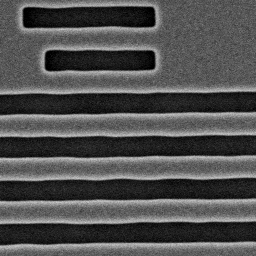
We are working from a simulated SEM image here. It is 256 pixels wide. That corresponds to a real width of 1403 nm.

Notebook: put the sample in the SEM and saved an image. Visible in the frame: groups of lines, slits or small figures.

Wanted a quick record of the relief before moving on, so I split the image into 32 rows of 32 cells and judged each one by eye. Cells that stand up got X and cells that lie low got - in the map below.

XXXXXXXXXXXXXXXXXXXXXXXXXXXXXXXX
XXX----------------XXXXXXXXXXXXX
XXX-----------------XXXXXXXXXXXX
XXX----------XXX---XXXXXXXXXXXXX
XXXXXXXXXXXXXXXXXXXXXXXXXXXXXXXX
XXXXXXXXXXXXXXXXXXXXXXXXXXXXXXXX
XXXXXX-------------XXXXXXXXXXXXX
XXXXX---------------XXXXXXXXXXXX
XXXXXX-------------XXXXXXXXXXXXX
XXXXXXXXXXXXXXXXXXXXXXXXXXXXXXXX
XXXXXXXXXXXXXXXXXXXXXXXXXXXXXXXX
XXXXXXXXXXXXXXXXXXX-------------
--------------------------------
--------------------------------
XXXXXXXXXXXXXXXXXXXXXXXXXXXXXXXX
XXXXXXXXXXXXXXXXXXXXXXXXXXXXXXXX
XXXXXXXXXXXXXXXXXXXXXXXXXXXXXXXX
--------------------------------
--------------------------------
--------------------------------
XXXXXXXXXXXXXXXXXXXXXXXXXXXXXXXX
XXXXXXXXXXXXXXXXXXXXXXXXXXXXXXXX
--------------------------------
--------------------------------
--------------------------------
XXXXXXXXXXXXXXXXXXXXXXXXXXXXXXXX
XXXXXXXXXXXXXXXXXXXXXXXXXXXXXXXX
XXXXXXXXXXXXXXXXXXXXXXXXXXXXXXXX
--------------------------------
--------------------------------
--------------XXXXXXXXXXXXXXXXXX
XXXXXXXXXXXXXXXXXXXXXXXXXXXXXXXX